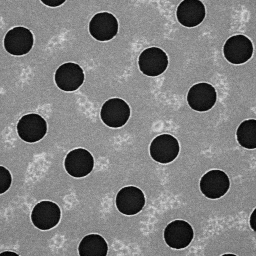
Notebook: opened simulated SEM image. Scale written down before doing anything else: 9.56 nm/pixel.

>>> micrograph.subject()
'a regular array of holes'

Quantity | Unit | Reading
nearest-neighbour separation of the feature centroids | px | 59.7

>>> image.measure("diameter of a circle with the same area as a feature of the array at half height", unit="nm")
286